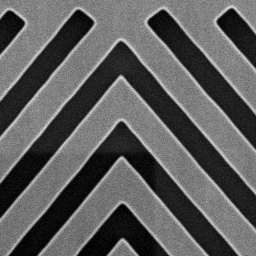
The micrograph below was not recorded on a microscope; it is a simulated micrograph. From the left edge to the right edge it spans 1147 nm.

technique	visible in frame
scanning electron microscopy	groups of lines, slits or small figures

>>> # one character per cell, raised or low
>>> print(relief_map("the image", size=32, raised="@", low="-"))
@@@@@@@@@@@@@@@@@@@@@@@@@@@@@@@@
@-@@@@@@@-@@@@@@@@@@-@@@@@@@--@@
---@@@@@----@@@@@@@---@@@@@----@
---@@@@@---@@@@@@@@----@@@@----@
--@@@@@----@@@@@@@@@---@@@@@----
-@@@@@----@@@@@-@@@@@---@@@@@---
@@@@@----@@@@@---@@@@----@@@@@--
@@@@----@@@@@----@@@@@----@@@@@-
@@@----@@@@@------@@@@@----@@@@@
@@@---@@@@@--------@@@@@----@@@@
@@----@@@@----@@----@@@@@----@@@
@----@@@@@---@@@@----@@@@@----@@
----@@@@@---@@@@@@----@@@@@---@@
---@@@@@----@@@@@@@----@@@@----@
--@@@@@----@@@@@@@@@---@@@@@----
-@@@@@----@@@@@-@@@@@---@@@@@---
-@@@@----@@@@@---@@@@----@@@@@--
@@@@----@@@@@----@@@@@----@@@@@-
@@@@---@@@@@------@@@@@----@@@@@
@@@----@@@@--------@@@@@----@@@@
@@----@@@@@---@@----@@@@@----@@@
@----@@@@@---@@@@----@@@@@---@@@
----@@@@@----@@@@@----@@@@@---@@
---@@@@@----@@@@@@@----@@@@----@
--@@@@@----@@@@@@@@@---@@@@@----
--@@@@----@@@@@@@@@@----@@@@@---
-@@@@@---@@@@@--@@@@@----@@@@@--
@@@@@----@@@@----@@@@@----@@@@@-
@@@@----@@@@------@@@@@----@@@@@
@@@----@@@@@-------@@@@@----@@@@
@@----@@@@@----@----@@@@@----@@@
@----@@@@@----@@@----@@@@@---@@@